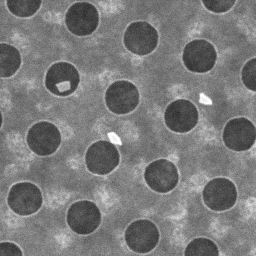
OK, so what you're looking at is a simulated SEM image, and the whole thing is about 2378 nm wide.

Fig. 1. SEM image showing a regular array of holes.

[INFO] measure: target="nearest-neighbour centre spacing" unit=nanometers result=571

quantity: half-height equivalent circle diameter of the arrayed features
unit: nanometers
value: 326